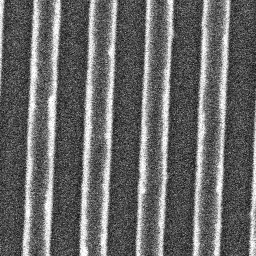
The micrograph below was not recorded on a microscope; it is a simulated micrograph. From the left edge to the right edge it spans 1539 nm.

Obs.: parallel lines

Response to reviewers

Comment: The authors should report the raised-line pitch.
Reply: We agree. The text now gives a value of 56.6 pixels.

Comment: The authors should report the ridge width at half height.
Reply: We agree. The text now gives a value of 147 nm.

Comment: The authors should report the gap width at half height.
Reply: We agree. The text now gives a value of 194 nm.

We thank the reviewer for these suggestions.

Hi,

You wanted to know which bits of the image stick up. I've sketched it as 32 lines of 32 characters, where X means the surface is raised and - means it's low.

----XXX----XXX-----XX-----XXX---
----XXX----XXX-----XX-----XX----
----XXX----XXX----XXX----XXX----
----XXX----XXX----XXX----XXX----
----XXX----XXX----XXX-----XX----
----XXX----XXX----XXX----XXX----
----XXX----XXX----XXX----XXX----
----XXX----XXX----XXX----XXX----
----XXX----XXX----XXX----XXX----
----XXX----XXX----XXX----XXX----
----XXX----XXX----XXX----XXX----
----XXX----XXX----XXX----XXX----
----XXX----XXX----XXX----XXX----
----XXX----XXX----XXX----XXX----
----XXX----XXX----XXX----XXX----
----XXX----XXX----XXX----XXX----
----XXX----XXX----XXX----XXX----
----XXX----XXX----XXX----XXX----
----XXX----XXX----XXX----XXX----
----XXX----XXX----XXX----XXX----
----XX-----XXX----XXX----XXX----
---XXX-----XXX----XXX----XXX----
---XXX-----XX-----XXX----XXX----
---XXX----XXX----XXXX----XXX----
---XXX----XXX----XXXX----XXX----
---XXX----XXX-----XX-----XX-----
---XXX----XXX----XXX-----XX----X
---XXX----XXX----XXX----XXX----X
---XXX----XXX----XXX----XXX----X
---XXX----XXX----XXX----XXX----X
---XXX----XXX----XXX----XXX----X
---XXX----XXX----XXX----XXX----X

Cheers